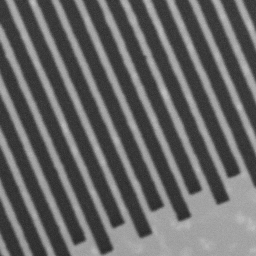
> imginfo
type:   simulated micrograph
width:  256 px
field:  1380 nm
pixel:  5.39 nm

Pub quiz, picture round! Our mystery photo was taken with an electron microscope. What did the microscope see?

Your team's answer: parallel lines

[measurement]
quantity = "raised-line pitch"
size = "113 nm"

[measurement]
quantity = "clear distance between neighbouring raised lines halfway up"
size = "76 nanometres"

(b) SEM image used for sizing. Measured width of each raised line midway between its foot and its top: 37.7 nm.